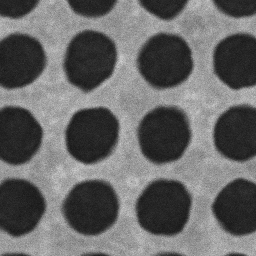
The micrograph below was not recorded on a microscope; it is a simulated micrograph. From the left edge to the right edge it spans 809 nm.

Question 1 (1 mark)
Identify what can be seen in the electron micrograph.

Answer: holes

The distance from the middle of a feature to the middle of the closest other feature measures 229 nm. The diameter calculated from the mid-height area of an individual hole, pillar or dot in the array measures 0.174 µm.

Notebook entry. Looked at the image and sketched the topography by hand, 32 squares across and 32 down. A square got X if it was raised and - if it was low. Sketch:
-----XXXX-----XXXX-----XXXX-----
----XXXXX-----XXXXX----XXXXX----
XXXXXXXXXXXXXXXXXXXXXXXXXXXXXXXX
XXXXXXXXXXXXXXXXXXXXXXXXXXXXXXXX
X--XXXXXX----XXXXXX---XXXXXXX--X
-----XXXX-----XXXX-----XXXX-----
------XX-------XXX------XXX-----
------XX-------XX-------XXX-----
------XX------XXX-------XXX-----
-----XXX------XXXX------XXX-----
----XXXXX----XXXXXX---XXXXXX----
XXXXXXXXXXXXXXXXXXXXXXXXXXXXXXXX
XXXXXXXXXXXXXXXXXXXXXXXXXXXXXXXX
---XXXXXXXXX-XXXXXXX--XXXXXXX---
----XXXXX-----XXXX-----XXXXX----
-----XXXX------XX-------XXX-----
-----XXX-------XX-------XXX-----
-----XXX-------XX-------XXX-----
-----XXX------XXXX-----XXXX-----
----XXXXX----XXXXX-----XXXXX----
X--XXXXXXXXXXXXXXXXXXXXXXXXXXXXX
XXXXXXXXXXXXXXXXXXXXXXXXXXXXXXXX
X--XXXXXXXX-XXXXXXXXXXXXXXXXX--X
-----XXXX-----XXXX-----XXXXX----
-----XXX-------XXX------XXX-----
------XX-------XX-------XXX-----
------XX-------XX-------XXX-----
-----XXX------XXX-------XXX-----
----XXXXX-----XXXX-----XXXXX----
XXXXXXXXXXXXXXXXXXXXXXXXXXXXXXXX
XXXXXXXXXXXXXXXXXXXXXXXXXXXXXXXX
XXXXXXXXXXXXXXXXXXXXXXXXXXXXXXXX